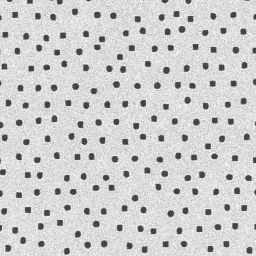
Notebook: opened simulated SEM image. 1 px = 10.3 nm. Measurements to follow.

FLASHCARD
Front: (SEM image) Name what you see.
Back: a regular array of holes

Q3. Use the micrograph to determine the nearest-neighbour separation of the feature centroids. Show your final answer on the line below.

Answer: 168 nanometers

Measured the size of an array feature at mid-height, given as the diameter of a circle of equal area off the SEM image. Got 71.6 nm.